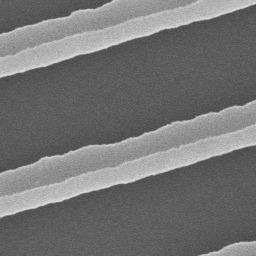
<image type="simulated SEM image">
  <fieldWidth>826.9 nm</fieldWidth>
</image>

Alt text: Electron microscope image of lines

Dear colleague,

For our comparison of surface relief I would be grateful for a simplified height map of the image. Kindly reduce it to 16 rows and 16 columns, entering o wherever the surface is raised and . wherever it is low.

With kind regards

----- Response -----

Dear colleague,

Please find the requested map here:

......ooooooooo.
..oooooooooo....
oooooooo........
ooooo...........
o...............
................
...............o
............oooo
.........ooooooo
....oooooooooo..
.oooooooooo.....
ooooooo.........
oooo............
................
................
..............oo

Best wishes